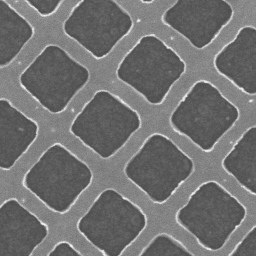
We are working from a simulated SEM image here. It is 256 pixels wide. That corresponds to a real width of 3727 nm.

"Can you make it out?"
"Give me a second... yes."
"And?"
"holes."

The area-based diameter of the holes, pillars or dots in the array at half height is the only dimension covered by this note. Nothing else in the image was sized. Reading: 58.9 pixels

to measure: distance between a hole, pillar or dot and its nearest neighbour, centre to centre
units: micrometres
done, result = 1.01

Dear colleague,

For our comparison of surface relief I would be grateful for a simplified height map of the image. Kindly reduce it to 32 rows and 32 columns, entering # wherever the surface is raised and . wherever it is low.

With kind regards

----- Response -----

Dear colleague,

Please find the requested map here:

.###...###.....#######......####
..###.###.......#####........###
...#####........#####........###
....####........######......###.
....#####......########....###..
...#######....###...####..###...
..###...###...##......######....
.###.....######........####.....
###........####........####.....
###........####.......######....
###.......######......###.####..
####......##.####....###...####.
#####....##....####.###.....####
..####..###.....######.......###
...#######.......#####........##
....#####........#####.......###
.....####........######.....###.
....######......###..###...###..
...###..###....###....###.###...
..###....####.###......#####....
..##......######........####....
####.......#####........#####...
###........#####.......#######..
####.......#######....###...###.
#####.....###..####..###.....###
#.####...###....#######.......##
....#######.......#####........#
.....#####........####........##
......####........#####......###
......#####......###.###....###.
.....#######....###...###...##..
....###...###..###......#####...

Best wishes